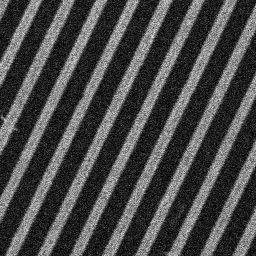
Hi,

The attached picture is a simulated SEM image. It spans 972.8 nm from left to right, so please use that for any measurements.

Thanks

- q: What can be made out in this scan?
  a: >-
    parallel lines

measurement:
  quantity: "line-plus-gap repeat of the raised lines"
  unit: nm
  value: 111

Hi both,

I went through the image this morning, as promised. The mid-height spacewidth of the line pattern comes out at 74.5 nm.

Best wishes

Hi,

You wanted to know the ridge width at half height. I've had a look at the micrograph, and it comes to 37.2 nanometers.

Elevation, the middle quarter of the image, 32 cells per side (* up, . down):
***.....***.....***.....***.....
**......**......**......**......
**.....***.....***.....***......
*......**......**......***.....*
*.....***.....***......**......*
......**......***.....**......**
......**.....***......**......**
.....**......***.....**......***
.....**.....***......**......**.
....**......***.....***.....***.
....**......**......**......**..
...**......***.....***.....***..
...**......**......**......**...
..***.....***.....***.....***...
..**......**......**......**....
.***.....***.....***.....***....
.**......**......**......**.....
***.....***.....***.....***.....
**......**......**......***.....
**.....***.....***.....***......
*......**......**......***.....*
*.....***.....***.....***......*
......**......**......***.....**
.....***.....***......**......**
.....**......**......***.....***
.....**.....***......**......**.
....**......**......***.....***.
...***.....***......**......**..
...**......**......***.....***..
..***.....***......**......**...
..**......**......***.....***...
.***......**......**......**....